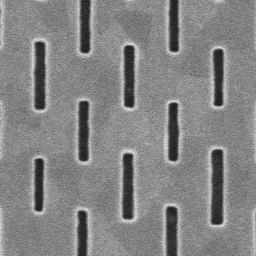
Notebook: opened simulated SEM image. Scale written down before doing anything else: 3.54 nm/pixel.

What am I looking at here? a regular array of holes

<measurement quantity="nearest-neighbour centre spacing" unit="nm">249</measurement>